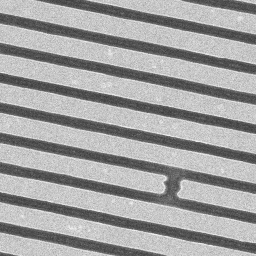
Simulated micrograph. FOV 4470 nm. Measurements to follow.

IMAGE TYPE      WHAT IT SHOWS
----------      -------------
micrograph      parallel lines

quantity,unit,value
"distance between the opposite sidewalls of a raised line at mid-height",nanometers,351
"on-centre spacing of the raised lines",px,29.3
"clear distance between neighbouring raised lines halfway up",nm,167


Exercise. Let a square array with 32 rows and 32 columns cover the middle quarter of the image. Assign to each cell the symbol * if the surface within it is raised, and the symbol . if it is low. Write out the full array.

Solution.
............********************
******...........***************
**********............**********
***************............*****
*********************...........
*************************.......
....**************************..
...........*********************
***............*****************
********...........*************
*************.............******
******************.............*
***********************.........
...*************************....
........************************
..............******************
*****..............*************
***********............*********
***************.............****
********************............
.************************.......
......*************************.
...........*********************
***.............****************
********.............***********
*************.............******
******************.............*
***********************.........
...***********************......
........*****************....***
**...........************....***
*******...........*******....***